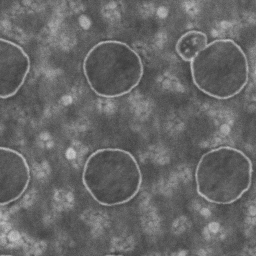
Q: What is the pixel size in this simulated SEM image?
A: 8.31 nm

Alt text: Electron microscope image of raised bodies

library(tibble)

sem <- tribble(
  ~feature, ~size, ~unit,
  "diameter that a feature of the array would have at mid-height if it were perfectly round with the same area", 470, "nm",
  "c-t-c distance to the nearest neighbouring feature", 871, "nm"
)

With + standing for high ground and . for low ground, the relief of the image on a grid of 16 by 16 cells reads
................
................
...........++...
++...++++..++++.
++...++++...+++.
+.....++....+++.
................
................
................
+.....++.....++.
++...++++...++++
++...++++...++++
+.....++.....++.
................
................
................